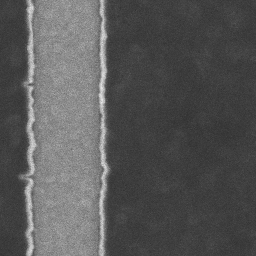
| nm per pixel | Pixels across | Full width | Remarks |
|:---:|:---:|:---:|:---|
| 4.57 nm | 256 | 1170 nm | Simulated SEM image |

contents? one or a few lines or trenches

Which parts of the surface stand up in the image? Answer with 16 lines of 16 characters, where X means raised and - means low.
XX----XXXXXXXXXX
XX----XXXXXXXXXX
XX----XXXXXXXXXX
XX----XXXXXXXXXX
XX----XXXXXXXXXX
XX----XXXXXXXXXX
XX----XXXXXXXXXX
XX----XXXXXXXXXX
XX----XXXXXXXXXX
XX----XXXXXXXXXX
XX----XXXXXXXXXX
XX----XXXXXXXXXX
XX----XXXXXXXXXX
XX----XXXXXXXXXX
XX----XXXXXXXXXX
XX----XXXXXXXXXX